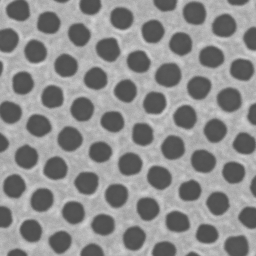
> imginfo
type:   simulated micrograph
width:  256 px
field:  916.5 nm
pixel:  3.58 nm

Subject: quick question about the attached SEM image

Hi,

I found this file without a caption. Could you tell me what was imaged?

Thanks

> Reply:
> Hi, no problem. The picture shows a regular array of holes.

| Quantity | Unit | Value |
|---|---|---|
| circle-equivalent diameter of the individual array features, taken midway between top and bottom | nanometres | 82.6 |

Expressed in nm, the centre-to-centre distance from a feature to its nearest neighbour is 115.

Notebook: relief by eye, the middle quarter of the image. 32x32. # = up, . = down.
...#############.....###....####
...###....#######....##......###
...##......############......###
#####......############......###
#####......###...######......##.
######....###.....#######..####.
############......#############.
#############.....###....######.
###...#######.....##.....#######
##.....########..###......######
##.....#############.....####...
#......#############.....###....
##.....###....########.####.....
###....##......############.....
#########......#############....
#########......###...#######....
...########...###.....##########
....#############.....##########
.....############.....###....###
.....####.#######.....###.....##
....###....#############......##
...###......############......##
######......###...#######.....##
#######....###.....#######...###
########..####......############
.#############......###.########
.#############.....##.....######
.###....#######...###......#####
###......############......#####
###......############......###..
###.....###....#######....###...
###.....##......########.####...